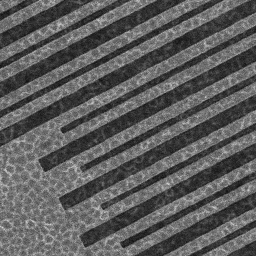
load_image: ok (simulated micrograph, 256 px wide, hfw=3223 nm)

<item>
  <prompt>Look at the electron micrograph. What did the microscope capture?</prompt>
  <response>parallel lines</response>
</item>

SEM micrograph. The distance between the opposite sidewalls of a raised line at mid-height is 134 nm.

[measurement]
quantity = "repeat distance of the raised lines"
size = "270 nanometers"